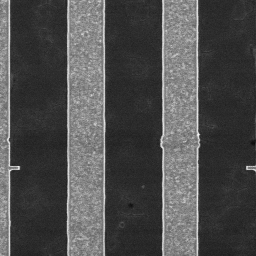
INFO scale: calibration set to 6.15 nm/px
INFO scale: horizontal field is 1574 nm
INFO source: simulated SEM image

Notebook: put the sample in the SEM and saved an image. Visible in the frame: one or a few lines or trenches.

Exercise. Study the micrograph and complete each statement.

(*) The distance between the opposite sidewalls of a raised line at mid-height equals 223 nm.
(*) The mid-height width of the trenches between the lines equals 360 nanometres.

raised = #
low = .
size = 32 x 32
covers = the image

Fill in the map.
#........####.......#####.......
#.......#####.......#####.......
#.......#####.......#####.......
#........####.......#####.......
#.......#####.......#####.......
#........####.......#####.......
#.......#####.......#####.......
#........####.......#####.......
#........####.......#####.......
#.......#####.......#####.......
#........####.......#####.......
#........####.......#####.......
#........####.......#####.......
#........####.......#####.......
#........####.......#####.......
#........####.......#####.......
#........####.......#####.......
#........####.......#####.......
#.......#####.......#####.......
#........####.......#####.......
#........####.......#####.......
#........####.......#####.......
#........####.......#####.......
#........####.......#####.......
#........####.......#####.......
#.......#####.......#####.......
#.......#####.......#####.......
#.......#####.......#####.......
#.......#####.......#####.......
#.......#####.......#####.......
#........####.......#####.......
#........####.......#####.......